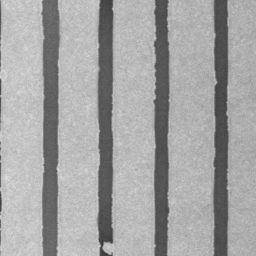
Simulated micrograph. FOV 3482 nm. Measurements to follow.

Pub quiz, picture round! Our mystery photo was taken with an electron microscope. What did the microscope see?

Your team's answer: parallel lines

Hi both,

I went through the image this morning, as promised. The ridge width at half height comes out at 571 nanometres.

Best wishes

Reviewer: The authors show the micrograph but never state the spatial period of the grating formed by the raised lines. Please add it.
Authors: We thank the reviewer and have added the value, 767 nm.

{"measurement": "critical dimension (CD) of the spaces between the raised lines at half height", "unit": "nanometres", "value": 190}